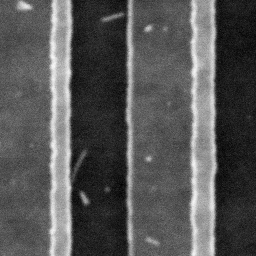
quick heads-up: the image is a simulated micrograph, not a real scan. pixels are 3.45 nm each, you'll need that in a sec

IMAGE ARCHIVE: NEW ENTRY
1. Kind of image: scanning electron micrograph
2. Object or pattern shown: lines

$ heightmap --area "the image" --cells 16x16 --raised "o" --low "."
oooo....ooooo...
oooo....ooooo...
oooo....ooooo...
oooo....ooooo...
oooo....ooooo...
oooo....ooooo...
oooo....ooooo...
oooo....ooooo...
oooo....ooooo...
oooo....ooooo...
oooo....ooooo...
oooo....ooooo...
oooo....ooooo...
oooo....ooooo...
oooo....ooooo...
oooo....ooooo...